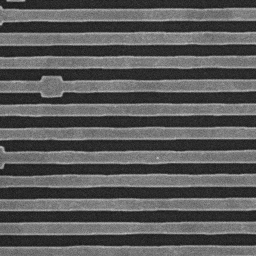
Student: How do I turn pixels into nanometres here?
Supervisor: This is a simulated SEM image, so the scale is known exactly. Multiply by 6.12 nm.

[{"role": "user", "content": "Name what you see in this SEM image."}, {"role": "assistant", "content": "wiring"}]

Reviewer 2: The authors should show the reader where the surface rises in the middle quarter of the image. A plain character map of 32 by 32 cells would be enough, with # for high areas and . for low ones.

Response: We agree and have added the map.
################################
................................
................................
................................
################################
################################
################################
................................
................................
................................
################################
################################
################################
................................
................................
................................
################################
################################
################################
................................
................................
................................
################################
################################
################################
................................
................................
................................
################################
################################
################################
................................